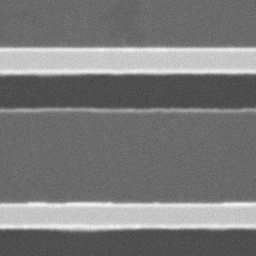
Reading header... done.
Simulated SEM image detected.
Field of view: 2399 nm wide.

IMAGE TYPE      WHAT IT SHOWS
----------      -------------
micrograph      lines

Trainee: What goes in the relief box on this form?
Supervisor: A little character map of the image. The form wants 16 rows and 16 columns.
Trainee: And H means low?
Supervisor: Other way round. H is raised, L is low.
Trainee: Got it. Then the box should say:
HHHHHHHHHHHHHHHH
HHHHHHHHHHHHHHHH
HHHHHHHHHHHHHHHH
HHHHHHHHHHHHHHHH
HHHHHHHHHHHHHHHH
LLLLLLLLLLLLLLLL
LLLLLLLLLLLLLLLL
HHHHHHHHHHHHHHHH
HHHHHHHHHHHHHHHH
HHHHHHHHHHHHHHHH
HHHHHHHHHHHHHHHH
HHHHHHHHHHHHHHHH
HHHHHHHHHHHHHHHH
HHHHHHHHHHHHHHHH
LLLLLLLLLLLLLLLL
LLLLLLLLLLLLLLLL